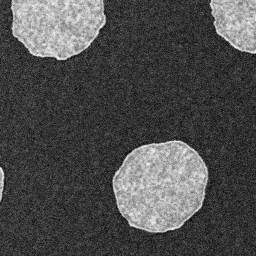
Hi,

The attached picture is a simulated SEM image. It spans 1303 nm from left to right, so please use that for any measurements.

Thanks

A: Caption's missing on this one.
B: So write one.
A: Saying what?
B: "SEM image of raised bodies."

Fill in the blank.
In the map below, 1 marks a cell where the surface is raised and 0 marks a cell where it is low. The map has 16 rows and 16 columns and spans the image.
0111110000000111
0111110000000111
0111110000000011
0001100000000000
0000000000000000
0000000000000000
0000000000000000
0000000000000000
0000000000000000
0000000011110000
0000000011111000
0000000111111000
0000000111111000
0000000011110000
0000000000000000
0000000000000000